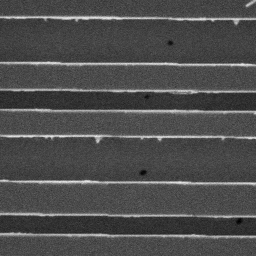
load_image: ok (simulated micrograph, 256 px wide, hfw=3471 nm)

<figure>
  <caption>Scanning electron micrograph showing lines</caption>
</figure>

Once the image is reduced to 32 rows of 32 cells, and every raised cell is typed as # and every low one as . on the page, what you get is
################################
################################
................................
................................
................................
................................
................................
................................
################################
################################
################################
................................
................................
................................
################################
################################
################################
................................
................................
................................
................................
................................
................................
################################
################################
################################
################################
................................
................................
#########################.......
################################
################################